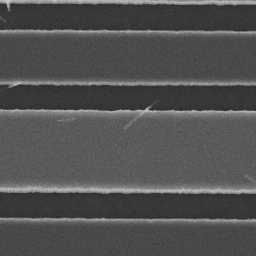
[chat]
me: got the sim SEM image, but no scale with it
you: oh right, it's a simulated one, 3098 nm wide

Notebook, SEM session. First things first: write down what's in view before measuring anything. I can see lines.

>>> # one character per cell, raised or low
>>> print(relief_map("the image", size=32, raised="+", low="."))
.....................+++++++++++
................................
................................
................................
++++++++++++++++++++++++++++++++
++++++++++++++++++++++++++++++++
++++++++++++++++++++++++++++++++
++++++++++++++++++++++++++++++++
++++++++++++++++++++++++++++++++
++++++++++++++++++++++++++++++++
++++++++++++++++++++++++++++++++
................................
................................
................................
++++++++++++++++++++++++++++++++
++++++++++++++++++++++++++++++++
++++++++++++++++++++++++++++++++
++++++++++++++++++++++++++++++++
++++++++++++++++++++++++++++++++
++++++++++++++++++++++++++++++++
++++++++++++++++++++++++++++++++
++++++++++++++++++++++++++++++++
++++++++++++++++++++++++++++++++
++++++++++++++++++++++++++++++++
................................
................................
................................
++++++++++++++++++++++++++.+++.+
++++++++++++++++++++++++++++++++
++++++++++++++++++++++++++++++++
++++++++++++++++++++++++++++++++
++++++++++++++++++++++++++++++++